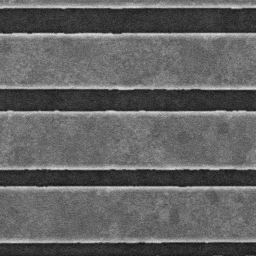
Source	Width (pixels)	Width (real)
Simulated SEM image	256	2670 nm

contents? lines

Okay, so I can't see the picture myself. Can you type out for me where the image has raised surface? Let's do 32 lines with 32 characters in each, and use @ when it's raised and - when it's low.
@@@@@@@@@@@@@@@@@@@@@@@@@@@@@@@@
--------------------------------
--------------------------------
--------------------------------
@@@-@@@@@@@@@@-@@@@@@@@@@@@@@-@@
@@@@@@@@@@@@@@@@@@@@@@@@@@@@@@@@
@@@@@@@@@@@@@@@@@@@@@@@@@@@@@@@@
@@@@@@@@@@@@@@@@@@@@@@@@@@@@@@@@
@@@@@@@@@@@@@@@@@@@@@@@@@@@@@@@@
@@@@@@@@@@@@@@@@@@@@@@@@@@@@@@@@
@@@@@@@@@@@@@@@@@@@@@@@@@@@@@@@@
--------------------------------
--------------------------------
--------------------------------
@@@@@@@@@@@@@@@@@@@@@@@@@@@@@@@@
@@@@@@@@@@@@@@@@@@@@@@@@@@@@@@@@
@@@@@@@@@@@@@@@@@@@@@@@@@@@@@@@@
@@@@@@@@@@@@@@@@@@@@@@@@@@@@@@@@
@@@@@@@@@@@@@@@@@@@@@@@@@@@@@@@@
@@@@@@@@@@@@@@@@@@@@@@@@@@@@@@@@
@@@@@@@@@@@@@@@@@@@@@@@@@@@@@@@@
--------------------------------
--------------------------------
--------------------------------
@@@@@@@@@@@@@@@@@@@@@@@@@@@@@@@@
@@@@@@@@@@@@@@@@@@@@@@@@@@@@@@@@
@@@@@@@@@@@@@@@@@@@@@@@@@@@@@@@@
@@@@@@@@@@@@@@@@@@@@@@@@@@@@@@@@
@@@@@@@@@@@@@@@@@@@@@@@@@@@@@@@@
@@@@@@@@@@@@@@@@@@@@@@@@@@@@@@@@
--------------------------------
--------------------------------